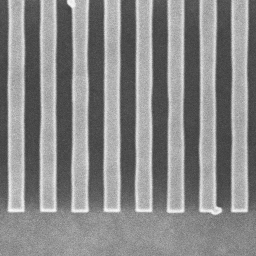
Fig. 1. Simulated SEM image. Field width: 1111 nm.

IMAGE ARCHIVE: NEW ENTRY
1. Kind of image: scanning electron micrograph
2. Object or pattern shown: groups of lines, slits or small figures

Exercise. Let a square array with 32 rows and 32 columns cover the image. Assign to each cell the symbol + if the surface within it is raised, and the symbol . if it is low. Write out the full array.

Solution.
.++..++..++..++..++..++..++..++.
.++..++..++..++..++..++..++..++.
.++..++..++..++..++..++..++..++.
.++..++..++..++..++..++..++..++.
.++..++..++..++..++..++..++..++.
.++..++..++..++..++..++..++..++.
.++..++..++..++..++..++..++..++.
.++..++..++..++..++..++..++..++.
.++..++..++..++..++..++..++..++.
.++..++..++..++..++..++..++..++.
.++..++..++..++..++..++..++..++.
.++..++..++..++..++..++..++..++.
.++..++..++..++..++..++..++..++.
.++..++..++..++..++..++..++..++.
.++..++..++..++..++..++..++..++.
.++..++..++..++..++..++..++..++.
.++..++..++..++..++..++..++..++.
.++..++..++..++..++..++..++..++.
.++..++..++..++..++..++..++..++.
.++..++..++..++..++..++..++..++.
.++..++..++..++..++..++..++..++.
.++..++..++..++..++..++..++..++.
.++..++..++..++..++..++..++..++.
.++..++..++..++..++..++..++..++.
.++..++..++..++..++..++..++..++.
.++..++..++..++..++..++..++..++.
..........................++....
................................
................................
................................
................................
................................